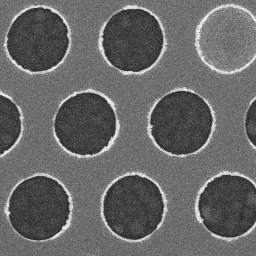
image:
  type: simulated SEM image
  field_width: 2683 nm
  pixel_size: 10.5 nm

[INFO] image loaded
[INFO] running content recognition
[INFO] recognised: holes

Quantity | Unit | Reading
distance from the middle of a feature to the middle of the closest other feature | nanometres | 992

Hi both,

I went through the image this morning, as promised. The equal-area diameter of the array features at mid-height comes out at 659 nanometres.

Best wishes